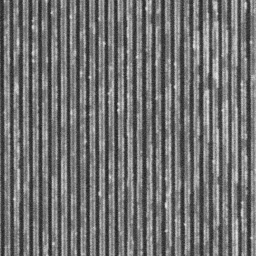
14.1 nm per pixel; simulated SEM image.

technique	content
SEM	parallel lines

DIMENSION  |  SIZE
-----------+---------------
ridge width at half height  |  61.6 nm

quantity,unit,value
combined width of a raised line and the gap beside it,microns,0.133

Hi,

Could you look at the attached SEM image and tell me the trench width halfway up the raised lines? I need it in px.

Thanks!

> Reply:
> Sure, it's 5.12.